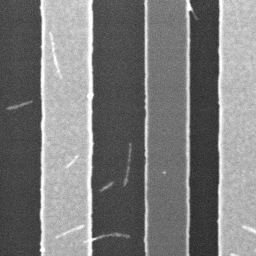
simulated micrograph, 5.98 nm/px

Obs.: lines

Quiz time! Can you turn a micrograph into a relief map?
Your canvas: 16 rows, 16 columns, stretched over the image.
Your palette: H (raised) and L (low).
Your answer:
LLLHHHLLLHHHLLHH
LLLHHHLLLHHHLLHH
LLLHHHLLLHHHLLHH
LLLHHHLLLHHHLLHH
LLLHHHLLLHHHLLHH
LLLHHHLLLHHHLLHH
LLLHHHLLLHHHLLHH
LLLHHHLLLHHHLLHH
LLLHHHLLLHHHLLHH
LLLHHHLLLHHHLLHH
LLLHHHLLLHHHLLHH
LLLHHHLLLHHHLLHH
LLLHHHLLLHHHLLHH
LLLHHHLLLHHHLLHH
LLLHHHLLLHHHLLHH
LLLHHHLLLHHHLLHH